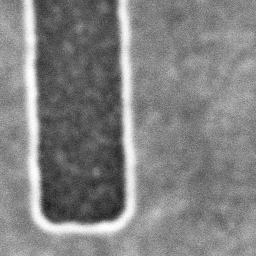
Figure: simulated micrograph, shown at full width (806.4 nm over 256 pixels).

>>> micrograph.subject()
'one or a few lines or trenches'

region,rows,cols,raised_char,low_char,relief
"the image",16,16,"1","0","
1100000011111111
1100000011111111
1100000011111111
1100000011111111
1100000011111111
1100000011111111
1100000011111111
1100000011111111
1100000011111111
1100000011111111
1100000011111111
1100000011111111
1100000011111111
1100000011111111
1111111111111111
1111111111111111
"